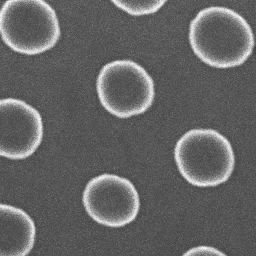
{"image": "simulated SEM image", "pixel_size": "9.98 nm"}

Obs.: raised bodies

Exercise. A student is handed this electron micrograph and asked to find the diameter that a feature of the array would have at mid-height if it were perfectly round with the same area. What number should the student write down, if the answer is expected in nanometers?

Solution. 546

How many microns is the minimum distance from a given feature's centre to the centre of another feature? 1.04